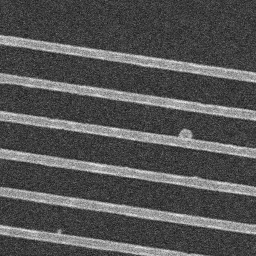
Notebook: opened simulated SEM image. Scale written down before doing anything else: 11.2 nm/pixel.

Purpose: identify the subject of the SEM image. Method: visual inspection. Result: parallel lines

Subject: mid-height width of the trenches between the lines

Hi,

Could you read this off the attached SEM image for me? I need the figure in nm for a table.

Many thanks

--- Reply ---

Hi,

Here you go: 322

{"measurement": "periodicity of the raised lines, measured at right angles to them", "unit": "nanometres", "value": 420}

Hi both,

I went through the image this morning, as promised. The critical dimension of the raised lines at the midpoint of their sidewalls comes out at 96.6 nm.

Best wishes